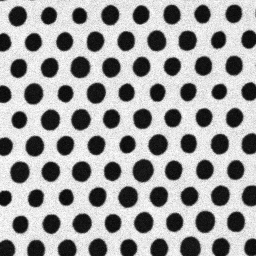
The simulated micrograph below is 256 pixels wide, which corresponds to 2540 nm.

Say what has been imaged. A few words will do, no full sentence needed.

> a regular array of holes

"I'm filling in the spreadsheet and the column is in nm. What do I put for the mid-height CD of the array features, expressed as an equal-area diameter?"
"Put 182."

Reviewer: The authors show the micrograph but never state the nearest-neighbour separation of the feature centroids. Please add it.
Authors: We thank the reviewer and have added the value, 297 nm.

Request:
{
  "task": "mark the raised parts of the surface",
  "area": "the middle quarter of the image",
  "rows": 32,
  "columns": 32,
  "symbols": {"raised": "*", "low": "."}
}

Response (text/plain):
**.....***....***.....***....***
**....****....***.....***....***
**....****....****...*****..****
********************************
********************************
.*****....*****..*****...*****..
..****....****....****...****...
..****....****....***....****...
..****....****...*****...****...
.******..**************.********
********************************
****..*****.*******..*****..****
**....****....****....***....***
**.....***....***.....***.....**
**.....***....***.....***....***
**....****...*****...*****..****
****.***************************
********************************
..*****...*****..*****...*****..
..****....****....***.....***...
..****....****....***.....***...
..****....****...****.....****..
..*****..*************..********
********************************
***...******.*****....****...***
**....****....***.....****...***
**.....***....***......**.....**
**.....***....***.....***....***
**....****....***.....****...***
****.**************.************
********************************
.******...****....****....****..